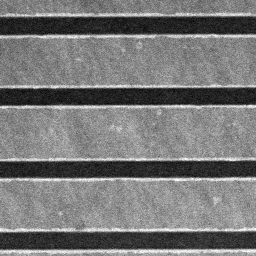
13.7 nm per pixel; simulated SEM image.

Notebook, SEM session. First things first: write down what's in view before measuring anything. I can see one or a few lines or trenches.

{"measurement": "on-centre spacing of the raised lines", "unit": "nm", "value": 986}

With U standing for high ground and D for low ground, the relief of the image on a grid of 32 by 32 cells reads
UUUUUUUUUUUUUUUUUUUUUUUUUUUUUUUU
UUUUUUUUUUUUUUUUUUUUUUUUUUUUUUUU
DDDDDDDDDDDDDDDDDDDDDDDDDDDDDDDD
DDDDDDDDDDDDDDDDDDDDDDDDDDDDDDDD
DDDDUUUUUUUUUUUUUUUUUUUUUUUUUUUU
UUUUUUUUUUUUUUUUUUUUUUUUUUUUUUUU
UUUUUUUUUUUUUUUUUUUUUUUUUUUUUUUU
UUUUUUUUUUUUUUUUUUUUUUUUUUUUUUUU
UUUUUUUUUUUUUUUUUUUUUUUUUUUUUUUU
UUUUUUUUUUUUUUUUUUUUUUUUUUUUUUUU
UUUUUUUUUUUUUUUUUUUUUUUUUUUUUUUU
DDDDDDDDDDDDDDDDDDDDDDDDDDDDDDDD
DDDDDDDDDDDDDDDDDDDDDDDDDDDDDDDD
UUUUUUUUUUUUUUUUUUUUUUUUUUUUUUUU
UUUUUUUUUUUUUUUUUUUUUUUUUUUUUUUU
UUUUUUUUUUUUUUUUUUUUUUUUUUUUUUUU
UUUUUUUUUUUUUUUUUUUUUUUUUUUUUUUU
UUUUUUUUUUUUUUUUUUUUUUUUUUUUUUUU
UUUUUUUUUUUUUUUUUUUUUUUUUUUUUUUU
UUUUUUUUUUUUUUUUUUUUUUUUUUUUUUUU
DDDDDDDDDDDDDDDDDDDDDDDDDDDDDDDD
DDDDDDDDDDDDDDDDDDDDDDDDDDDDDDDD
UUUUUUUUUUUUUUUUUUUUUUUUUUUUUUUU
UUUUUUUUUUUUUUUUUUUUUUUUUUUUUUUU
UUUUUUUUUUUUUUUUUUUUUUUUUUUUUUUU
UUUUUUUUUUUUUUUUUUUUUUUUUUUUUUUU
UUUUUUUUUUUUUUUUUUUUUUUUUUUUUUUU
UUUUUUUUUUUUUUUUUUUUUUUUUUUUUUUU
UUUUUUUUUUUUUUUUUUUUUUUUUUUUUUUU
DDDDDDDDDDDDDDDDDDDDDDDDDDDDDDDD
DDDDDDDDDDDDDDDDDDDDDDDDDDDDDDDD
UUUUUUUUUUUUUUUUUUUUUUUUUUUUUUUU